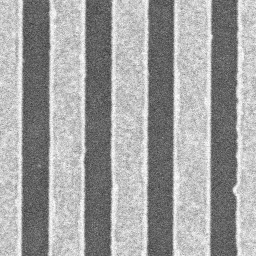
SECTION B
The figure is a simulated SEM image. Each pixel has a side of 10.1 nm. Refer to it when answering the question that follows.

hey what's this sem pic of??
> one or a few lines or trenches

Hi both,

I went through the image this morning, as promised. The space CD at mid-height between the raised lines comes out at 307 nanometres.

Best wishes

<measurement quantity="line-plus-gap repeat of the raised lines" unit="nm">633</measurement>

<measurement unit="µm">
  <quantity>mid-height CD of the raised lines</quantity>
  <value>0.327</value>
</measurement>